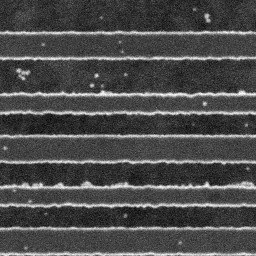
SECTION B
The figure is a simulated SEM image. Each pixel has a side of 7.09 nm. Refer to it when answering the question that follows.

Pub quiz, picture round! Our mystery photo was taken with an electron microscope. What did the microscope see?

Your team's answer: lines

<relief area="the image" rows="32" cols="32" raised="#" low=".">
................................
................................
................................
................................
################################
################################
################################
................................
................................
................................
................................
................................
################################
################################
................................
................................
................................
################################
################################
################################
................................
................................
................................
################################
################################
################################
................................
................................
.##..##.##.#.###.###.#.#########
################################
################################
################################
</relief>